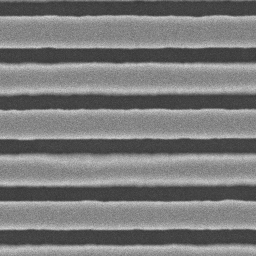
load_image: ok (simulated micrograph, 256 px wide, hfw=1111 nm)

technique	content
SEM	lines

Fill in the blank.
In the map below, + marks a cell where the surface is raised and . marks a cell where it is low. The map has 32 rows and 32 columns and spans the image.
................................
................................
++++++++++++++++++++++++++++++++
++++++++++++++++++++++++++++++++
++++++++++++++++++++++++++++++++
++++++++++++++++++++++++++++++++
................................
................................
++++++++++++++++++++++++++++++++
++++++++++++++++++++++++++++++++
++++++++++++++++++++++++++++++++
++++++++++++++++++++++++++++++++
................................
................................
++++++++++++++++++++++++++++++++
++++++++++++++++++++++++++++++++
++++++++++++++++++++++++++++++++
................................
................................
++++++++++++++++++++++++++++++++
++++++++++++++++++++++++++++++++
++++++++++++++++++++++++++++++++
++++++++++++++++++++++++++++++++
................................
................................
++++++++++++++++++++++++++++++++
++++++++++++++++++++++++++++++++
++++++++++++++++++++++++++++++++
++++++++++++++++++++++++++++++++
................................
................................
++++++++++++++++++++++++++++++++